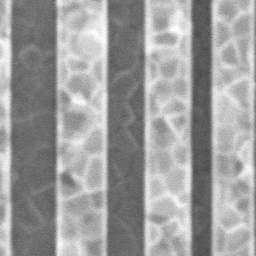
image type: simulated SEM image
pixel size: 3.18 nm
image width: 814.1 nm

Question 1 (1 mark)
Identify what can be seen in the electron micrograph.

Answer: one or a few lines or trenches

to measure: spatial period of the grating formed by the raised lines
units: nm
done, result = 241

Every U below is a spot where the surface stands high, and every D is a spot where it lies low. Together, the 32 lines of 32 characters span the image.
UDDDDDDUUUUUUDDDDDUUUUUUDDDUUUUU
UDDDDDDUUUUUUDDDDDUUUUUUDDDUUUUD
UDDDDDDUUUUUUDDDDDUUUUUUDDDUUUUU
UDDDDDDUUUUUUDDDDDUUUUUUDDDUUUUU
UDDDDDDUUUUUUDDDDDUUUUUUDDDUUUUU
UDDDDDDUUUUUUDDDDDUUUUUUDDDUUUUD
UDDDDDDUUUUUUDDDDDUUUUUUDDDUUUUU
UDDDDDDUUUUUUDDDDDUUUUUUDDDUUUUU
UDDDDDDUUUUUUDDDDDUUUUUUDDDUUUUU
UDDDDDDUUUUUUDDDDDUUUUUUDDDUUUUU
UDDDDDDUUUUUUDDDDDUUUUUUDDDUUUUU
UDDDDDDUUUUUUDDDDDUUUUUUDDDUUUUU
UDDDDDDUUUUUUDDDDDUUUUUUDDDUUUUU
UDDDDDDUUUUUUDDDDDUUUUUUDDDUUUUU
UDDDDDDUUUUUUDDDDDUUUUUUDDDUUUUU
UDDDDDDUUUUUUDDDDDUUUUUUDDDUUUUU
UDDDDDDUUUUUUDDDDDUUUUUUDDDUUUUU
UDDDDDDUUUUUUDDDDDUUUUUUDDDUUUUU
UDDDDDDUUUUUUDDDDDUUUUUUDDDUUUUD
UDDDDDDUUUUUUDDDDDUUUUUUDDDUUUUU
UDDDDDDUUUUUUDDDDDUUUUUUDDDUUUUU
UDDDDDDUUUUUUDDDDDUUUUUUDDDUUUUU
UDDDDDDUUUUUUDDDDDUUUUUUDDDUUUUU
UDDDDDDUUUUUUDDDDDUUUUUUDDDUUUUU
UDDDDDDUUUUUUDDDDDUUUUUUDDDUUUUU
UDDDDDDUUUUUUDDDDDUUUUUUDDDUUUUU
UDDDDDDUUUUUUDDDDDUUUUUUDDDUUUUU
UDDDDDDUUUUUUDDDDDUUUUUUDDDUUUUU
UDDDDDDUUUUUUDDDDDUUUUUUDDDUUUUU
UDDDDDDUUUUUUDDDDDUUUUUUDDDUUUUU
UDDDDDDUUUUUUDDDDDUUUUUUDDDUUUUU
UDDDDDDUUUUUUDDDDDUUUUUUDDDUUUUU